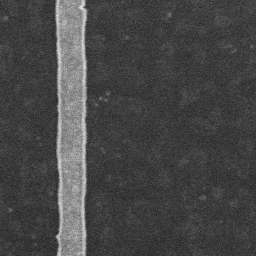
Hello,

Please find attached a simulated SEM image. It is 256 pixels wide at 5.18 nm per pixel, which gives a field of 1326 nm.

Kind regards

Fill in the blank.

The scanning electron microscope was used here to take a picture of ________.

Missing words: one or a few lines or trenches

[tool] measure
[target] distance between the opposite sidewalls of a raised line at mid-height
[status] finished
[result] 131 nm